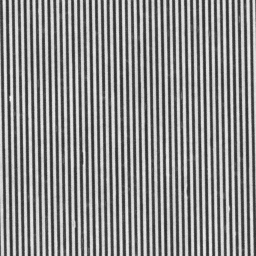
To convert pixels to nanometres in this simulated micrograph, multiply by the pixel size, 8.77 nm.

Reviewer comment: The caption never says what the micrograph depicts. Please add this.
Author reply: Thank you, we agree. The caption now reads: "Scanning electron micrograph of parallel lines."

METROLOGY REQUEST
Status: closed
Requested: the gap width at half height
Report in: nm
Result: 29.6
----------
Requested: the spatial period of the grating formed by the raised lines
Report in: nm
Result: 52.1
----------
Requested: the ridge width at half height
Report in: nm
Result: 20.8